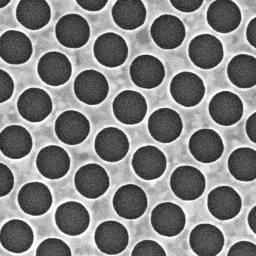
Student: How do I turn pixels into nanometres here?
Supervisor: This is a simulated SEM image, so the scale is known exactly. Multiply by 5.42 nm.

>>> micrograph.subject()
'a regular array of holes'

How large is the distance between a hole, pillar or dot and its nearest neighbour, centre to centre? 224 nm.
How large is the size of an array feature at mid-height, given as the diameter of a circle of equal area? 0.193 µm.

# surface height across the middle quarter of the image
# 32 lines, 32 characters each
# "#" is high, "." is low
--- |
..########....##.........#######
..###...########.........#######
..##......######.........###....
..#.......#######........##.....
.#.........######........##.....
##.........#######......##......
##.........#####.#########......
###........###.....#######......
###........##.......#######.....
####......##.........#######....
############.........#########..
#.##########.........##.....####
.....#######.........#.......###
......#######.......#........###
......########.....##.........##
.......##############.........##
.......##.....#######.........##
......##.......######........###
......##........######......###.
.....###........########...####.
#######.........####...########.
########........##......#######.
.#######........#........#######
.########......##.........######
..#########..####.........######
..###....########.........###...
.##.......#######........###....
.##........#######.......##.....
###........########.....###.....
##.........###############......
###........###.....#######......
###........##.......#######.....